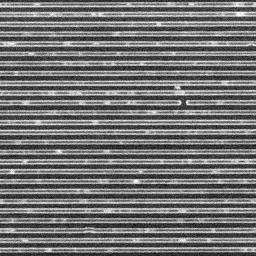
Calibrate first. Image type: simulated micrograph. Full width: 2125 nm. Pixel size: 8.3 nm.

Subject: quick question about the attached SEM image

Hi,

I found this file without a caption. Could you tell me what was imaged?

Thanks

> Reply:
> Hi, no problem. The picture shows parallel lines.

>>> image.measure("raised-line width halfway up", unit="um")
0.0322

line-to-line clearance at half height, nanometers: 45.6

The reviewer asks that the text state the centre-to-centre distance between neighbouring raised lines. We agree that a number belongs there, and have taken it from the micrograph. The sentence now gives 0.0815 micrometres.